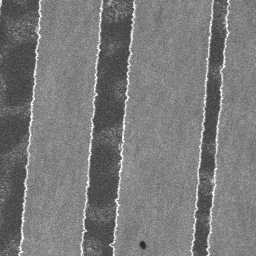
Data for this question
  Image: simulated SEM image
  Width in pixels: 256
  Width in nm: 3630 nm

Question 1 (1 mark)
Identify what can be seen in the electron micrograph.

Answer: one or a few lines or trenches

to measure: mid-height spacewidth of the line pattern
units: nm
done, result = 985